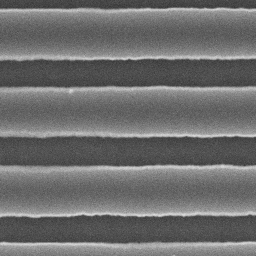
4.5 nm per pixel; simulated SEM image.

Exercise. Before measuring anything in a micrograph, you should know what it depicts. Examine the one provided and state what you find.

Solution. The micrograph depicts lines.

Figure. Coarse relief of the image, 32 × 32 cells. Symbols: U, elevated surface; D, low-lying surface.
DDDDDDDDDDDDDDDDDDDDDDDDDDDDDDDD
UUUUUUUUUUUUUUUUUUUUUUUUUUUUUUUU
UUUUUUUUUUUUUUUUUUUUUUUUUUUUUUUU
UUUUUUUUUUUUUUUUUUUUUUUUUUUUUUUU
UUUUUUUUUUUUUUUUUUUUUUUUUUUUUUUU
UUUUUUUUUUUUUUUUUUUUUUUUUUUUUUUU
UUUUUUUUUUUUUUUUUUUUUUUUUUUUUUUU
DDDDDDDDDDDDDDDDDDDDDDDDDDDDDDDD
DDDDDDDDDDDDDDDDDDDDDDDDDDDDDDDD
DDDDDDDDDDDDDDDDDDDDDDDDDDDDDDDD
DDDDDDDDDDDDDDDDDDDDDDDDDDDDDDDD
UUUUUUUUUUUUUUUUUUUUUUUUUUUUUUUU
UUUUUUUUUUUUUUUUUUUUUUUUUUUUUUUU
UUUUUUUUUUUUUUUUUUUUUUUUUUUUUUUU
UUUUUUUUUUUUUUUUUUUUUUUUUUUUUUUU
UUUUUUUUUUUUUUUUUUUUUUUUUUUUUUUU
UUUUUUUUUUUUUUUUUUUUUUUUUUUUUUUU
DDDDDDDDDDDDDDDDDDDDDDDDDDDDDDDD
DDDDDDDDDDDDDDDDDDDDDDDDDDDDDDDD
DDDDDDDDDDDDDDDDDDDDDDDDDDDDDDDD
DDDDDDDDDDDDDDDDDDDDDDDDDDDDDDDD
UUUUUUUUUUUUUUUUUUUUUUUUUUUUUUUU
UUUUUUUUUUUUUUUUUUUUUUUUUUUUUUUU
UUUUUUUUUUUUUUUUUUUUUUUUUUUUUUUU
UUUUUUUUUUUUUUUUUUUUUUUUUUUUUUUU
UUUUUUUUUUUUUUUUUUUUUUUUUUUUUUUU
UUUUUUUUUUUUUUUUUUUUUUUUUUUUUUUU
DDDDDDDDDDDDDDDDDDDDDDDDDDDDDDDD
DDDDDDDDDDDDDDDDDDDDDDDDDDDDDDDD
DDDDDDDDDDDDDDDDDDDDDDDDDDDDDDDD
UUDDDUUDUDUDDDDDDDDDDDDDDUDDUUUU
UUUUUUUUUUUUUUUUUUUUUUUUUUUUUUUU